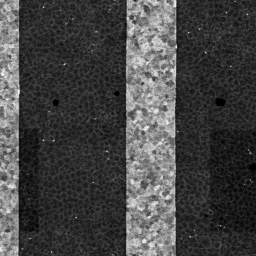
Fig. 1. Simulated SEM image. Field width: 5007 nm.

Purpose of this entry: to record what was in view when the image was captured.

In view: one or a few lines or trenches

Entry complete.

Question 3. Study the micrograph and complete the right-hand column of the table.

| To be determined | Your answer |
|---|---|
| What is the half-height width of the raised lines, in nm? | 951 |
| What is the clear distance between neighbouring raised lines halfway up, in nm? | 2110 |